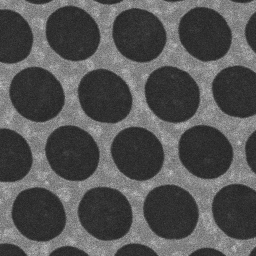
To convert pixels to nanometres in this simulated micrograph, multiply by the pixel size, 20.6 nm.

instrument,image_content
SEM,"a regular array of holes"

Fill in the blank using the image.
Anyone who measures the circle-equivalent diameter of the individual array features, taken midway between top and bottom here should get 1130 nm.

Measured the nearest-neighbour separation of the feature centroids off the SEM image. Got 1360 nanometers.